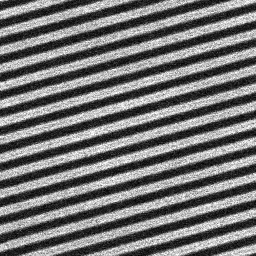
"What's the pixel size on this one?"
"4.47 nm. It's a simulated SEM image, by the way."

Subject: parallel lines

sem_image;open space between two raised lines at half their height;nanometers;41.5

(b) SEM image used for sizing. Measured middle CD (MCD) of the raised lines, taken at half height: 37.2 nanometres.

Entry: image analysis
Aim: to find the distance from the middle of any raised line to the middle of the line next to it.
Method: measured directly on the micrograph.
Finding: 77.1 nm